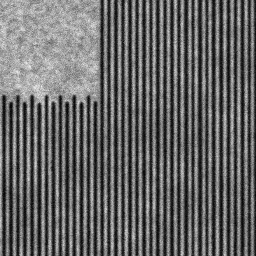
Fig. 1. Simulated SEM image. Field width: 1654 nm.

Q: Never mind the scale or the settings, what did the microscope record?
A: parallel lines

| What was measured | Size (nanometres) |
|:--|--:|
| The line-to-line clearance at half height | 24.2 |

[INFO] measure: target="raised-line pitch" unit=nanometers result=45.1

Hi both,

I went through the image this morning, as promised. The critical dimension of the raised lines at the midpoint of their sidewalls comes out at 18.6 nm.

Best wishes